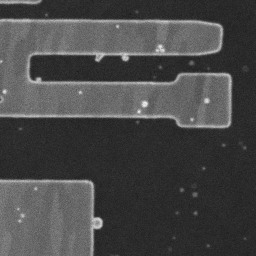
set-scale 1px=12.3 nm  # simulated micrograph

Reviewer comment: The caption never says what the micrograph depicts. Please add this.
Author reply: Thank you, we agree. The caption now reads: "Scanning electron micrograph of wiring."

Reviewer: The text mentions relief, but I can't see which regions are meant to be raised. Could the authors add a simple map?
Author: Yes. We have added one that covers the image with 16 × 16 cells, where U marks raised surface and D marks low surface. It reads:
DDDDDDDDDDDDDDDD
UUUUUUUUUUUUUDDD
UUUUUUUUUUUUUUDD
UUDDDDDDDDDDDDDD
UUDDDDDDDDDDDDDD
UUUUUUUUUUUUUUDD
UUUUUUUUUUUUUUDD
DDDDDDDDDDDUUUDD
DDDDDDDDDDDDDDDD
DDDDDDDDDDDDDDDD
DDDDDDDDDDDDDDDD
UUUUUUDDDDDDDDDD
UUUUUUDDDDDDDDDD
UUUUUUDDDDDDDDDD
UUUUUUDDDDDDDDDD
UUUUUUDDDDDDDDDD